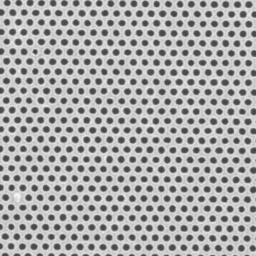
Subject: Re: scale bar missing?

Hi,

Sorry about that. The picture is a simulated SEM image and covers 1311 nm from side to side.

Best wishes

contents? a regular array of holes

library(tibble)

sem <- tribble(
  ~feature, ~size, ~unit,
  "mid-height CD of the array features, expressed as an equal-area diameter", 37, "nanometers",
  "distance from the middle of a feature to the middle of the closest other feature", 11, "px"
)